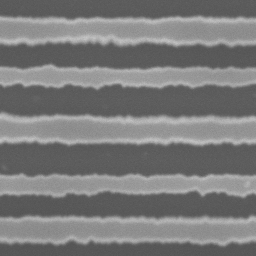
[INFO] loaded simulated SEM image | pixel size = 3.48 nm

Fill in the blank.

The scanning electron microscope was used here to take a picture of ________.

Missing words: lines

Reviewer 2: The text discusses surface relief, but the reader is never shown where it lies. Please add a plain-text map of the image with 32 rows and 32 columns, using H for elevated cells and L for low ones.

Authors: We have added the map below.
LLLLLLLLLLLLLLLLLLLLLLLLLLLLLLLL
LLLLLLLLLLLLLLLLLLLLLLLLLLLLLLLL
HHHHHHHHLHHHHHHHHHHLHHHHHHHHHHHH
HHHHHHHHHHHHHHHHHHHHHHHHHHHHHHHH
HHHHHHHHHHHHHHHHHHHHHHHHHHHHHHHH
LLLLLLLLLLLLLLLLLLLLLLHLLLHLHHLL
LLLLLLLLLLLLLLLLLLLLLLLLLLLLLLLL
LLLLLLLLLLLLLLLLLLLLLLLLLLLLLLLL
HLLLHHHLLLLLLLLLLLLLLHLLHHLLLLLL
HHHHHHHHHHHHHHHHHHHHHHHHHHHHHHHH
HHLHHHHHLHHHHHLHHHHHHHHHHHHHHHHL
LLLLLLLLLLLLLLLLLLLLLLLLLLLLLLLL
LLLLLLLLLLLLLLLLLLLLLLLLLLLLLLLL
LLLLLLLLLLLLLLLLLLLLLLLLLLLLLLLL
HLLLLLLHLLLLLLLLLLLLLLLLLLLLLLLL
HHHHHHHHHHHHHHHHHHHHHHHHHHHHHHHH
HHHHHHHHHHHHHHHHHHHHHHHHHHHHHHHH
HHHHHHHHHHHHHHHHHHHHHHHHHHHHHHHH
LLLLLLLLLLLLLLLLLLLLLLLLLLLLLLLL
LLLLLLLLLLLLLLLLLLLLLLLLLLLLLLLL
LLLLLLLLLLLLLLLLLLLLLLLLLLLLLLLL
LLLLLLLLLLLLLLLLLLLLLLLLLLLLLLLL
HHHHHHHHHHHHHHHHHHHHHHHHHHHHHHHH
HHHHHHHHHHHHHHHHHHHHHHHHHHHHHHHH
LLLLLLLHLLLLLLLLLLLLLLLLLLLLLLHL
LLLLLLLLLLLLLLLLLLLLLLLLLLLLLLLL
LLLLLLLLLLLLLLLLLLLLLLLLLLLLLLLL
HHHHHHHHHHHHHHHHHHHHHHHHHHHHHHHH
HHHHHHHHHHHHHHHHHHHHHHHHHHHHHHHH
HHHHHHHHHHHHHHHHHHHHHHHHHHHHHHHH
LLLLLLLLLLLLLLLLLLLLLLLLLLLHLLLL
LLLLLLLLLLLLLLLLLLLLLLLLLLLLLLLL